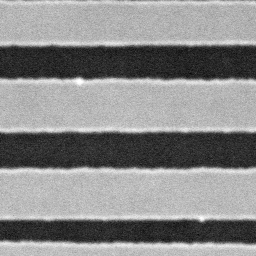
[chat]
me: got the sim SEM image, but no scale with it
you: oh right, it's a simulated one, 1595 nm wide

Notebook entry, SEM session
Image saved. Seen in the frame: lines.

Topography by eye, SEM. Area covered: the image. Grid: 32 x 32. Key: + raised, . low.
++++++++++++++++++++++++++++++++
++++++++++++++++++++++++++++++++
++++++++++++++++++++++++++++++++
++++++++++++++++++++++++++++++++
++++++++++++++++++++++++++++++++
++++++.+++++++++.+.....++.+.....
................................
................................
................................
................................
++++++++++++++++++++++++++++++++
++++++++++++++++++++++++++++++++
++++++++++++++++++++++++++++++++
++++++++++++++++++++++++++++++++
++++++++++++++++++++++++++++++++
++++++++++++++++++++++++++++++++
................................
................................
................................
................................
................................
++++++++++++++++++++++++++++++++
++++++++++++++++++++++++++++++++
++++++++++++++++++++++++++++++++
++++++++++++++++++++++++++++++++
++++++++++++++++++++++++++++++++
++++++++++++++++++++++++++++++++
................................
................................
................................
++++++++++...+++.+.......++.....
++++++++++++++++++++++++++++++++